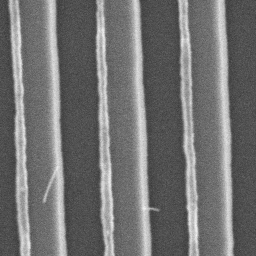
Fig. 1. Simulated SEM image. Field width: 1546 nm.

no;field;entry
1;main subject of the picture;lines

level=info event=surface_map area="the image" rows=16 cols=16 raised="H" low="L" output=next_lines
LHHLLLHHHLLHHHLL
LHHLLLHHHLLHHHLL
LHHLLLHHHLLHHHLL
LHHLLLHHHLLHHHLL
LHHLLLHHHLLHHHLL
LHHLLLHHHLLHHHLL
LHHHLLHHHLLLHHLL
LHHHLLHHHLLLHHLL
LHHHLLHHHLLLHHLL
LHHHLLHHHLLLHHLL
LHHHLLHHHLLLHHLL
LHHHLLHHHLLLHHLL
LHHHLLHHHLLLHHLL
LHHHLLHHHLLLHHLL
LHHHLLLHHLLLHHLL
LHHHLLLHHLLLHHLL